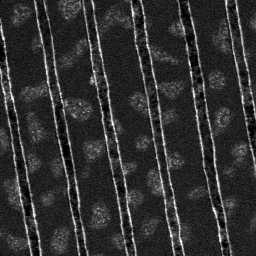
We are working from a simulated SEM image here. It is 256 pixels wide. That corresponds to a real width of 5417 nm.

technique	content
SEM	parallel lines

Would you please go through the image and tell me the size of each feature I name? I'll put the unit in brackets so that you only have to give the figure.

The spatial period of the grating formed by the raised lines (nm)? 992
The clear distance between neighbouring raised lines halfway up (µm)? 0.771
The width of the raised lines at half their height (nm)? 208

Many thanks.